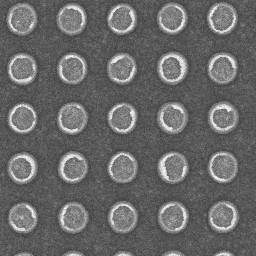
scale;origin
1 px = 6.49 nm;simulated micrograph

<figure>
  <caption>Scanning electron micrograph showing a regular array of raised bodies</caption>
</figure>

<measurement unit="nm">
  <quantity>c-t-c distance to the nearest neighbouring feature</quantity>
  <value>322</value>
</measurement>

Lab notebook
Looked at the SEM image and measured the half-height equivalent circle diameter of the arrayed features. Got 188 nm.